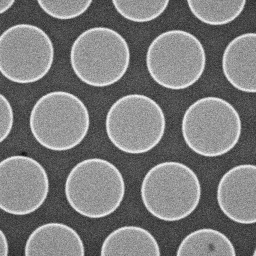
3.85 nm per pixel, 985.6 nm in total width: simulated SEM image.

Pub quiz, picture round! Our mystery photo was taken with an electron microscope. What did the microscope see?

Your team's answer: an array of small figures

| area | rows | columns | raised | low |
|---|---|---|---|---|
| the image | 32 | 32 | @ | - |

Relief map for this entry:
@----@@@@@@---@@@@@@@---@@@@@@--
------@@@@-----@@@@@----@@@@@@--
----------------@@@------@@@@---
-@@@@---------------------------
@@@@@@----@@@@@-----@@@@------@@
@@@@@@---@@@@@@@---@@@@@@----@@@
@@@@@@@--@@@@@@@---@@@@@@---@@@@
@@@@@@@--@@@@@@@--@@@@@@@@--@@@@
@@@@@@---@@@@@@@---@@@@@@---@@@@
-@@@@-----@@@@@----@@@@@@---@@@@
-----------@@@------@@@@-----@@@
--------------------------------
@----@@@@@-----@@@@------@@@----
@---@@@@@@@---@@@@@@----@@@@@---
@@--@@@@@@@--@@@@@@@---@@@@@@@--
@---@@@@@@@--@@@@@@@@--@@@@@@@--
@---@@@@@@@--@@@@@@@---@@@@@@@--
-----@@@@@----@@@@@@---@@@@@@@--
------@@@------@@@@-----@@@@@---
--------------------------------
@@@@@-----@@@@------@@@---------
@@@@@@---@@@@@@----@@@@@-----@@@
@@@@@@--@@@@@@@---@@@@@@@---@@@@
@@@@@@--@@@@@@@---@@@@@@@--@@@@@
@@@@@@--@@@@@@@---@@@@@@@--@@@@@
@@@@@----@@@@@@---@@@@@@@--@@@@@
-@@@------@@@@-----@@@@@----@@@@
---------------------@-------@@@
-----@@@@------@@---------------
@---@@@@@@----@@@@@----@@@@@----
@--@@@@@@@---@@@@@@@---@@@@@@---
@--@@@@@@@---@@@@@@@--@@@@@@@---